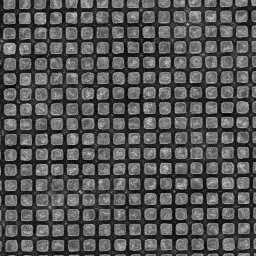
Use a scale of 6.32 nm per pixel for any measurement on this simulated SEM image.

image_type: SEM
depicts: a regular array of raised bodies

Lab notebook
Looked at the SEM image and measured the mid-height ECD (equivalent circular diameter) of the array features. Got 0.0795 um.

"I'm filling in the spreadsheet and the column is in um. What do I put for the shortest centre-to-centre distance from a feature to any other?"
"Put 0.0947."